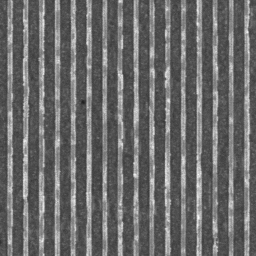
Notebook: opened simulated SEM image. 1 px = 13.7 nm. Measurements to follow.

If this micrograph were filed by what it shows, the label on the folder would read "parallel lines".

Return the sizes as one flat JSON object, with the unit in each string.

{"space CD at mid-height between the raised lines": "0.157 um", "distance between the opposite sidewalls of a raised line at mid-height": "53 nanometers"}